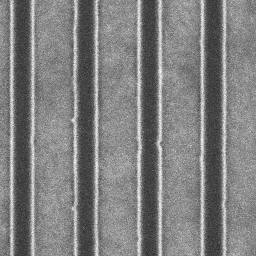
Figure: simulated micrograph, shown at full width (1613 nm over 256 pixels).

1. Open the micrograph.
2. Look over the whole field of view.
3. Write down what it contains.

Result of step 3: one or a few lines or trenches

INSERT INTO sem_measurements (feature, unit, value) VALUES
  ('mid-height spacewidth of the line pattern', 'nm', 258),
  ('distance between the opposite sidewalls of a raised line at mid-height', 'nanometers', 143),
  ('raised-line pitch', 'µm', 0.401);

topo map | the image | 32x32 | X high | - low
-XXX-----XXX-----XXX-----XXX----
-XXX-----XXX-----XXX-----XXX----
-XXX-----XXX-----XXX-----XXX----
-XXX-----XXX-----XXX-----XXX----
-XXX-----XXX-----XXX-----XXX----
--XX-----XXX-----XXX-----XXX----
-XXX-----XXX-----XXX-----XXX----
-XXX-----XXX-----XXX-----XXX----
-XXX-----XXX-----XXX-----XXX----
-XXX-----XXX-----XXX-----XXX----
-XXX-----XXX-----XXX-----XXX----
-XXX-----XXX-----XXX-----XXX----
-XXX-----XXX-----XXX-----XXX----
-XXX-----XXX-----XXX-----XXX----
-XXX-----XXX-----XXX-----XXX----
-XXX-----XXX-----XXX-----XXX----
-XXX-----XXX-----XXX-----XXX----
-XXX-----XXX-----XXX-----XXX----
-XXX-----XXX-----XXX-----XXX----
-XXX-----XXX-----XXX-----XXX----
-XXX-----XXX-----XXX-----XXX----
-XXX-----XXX-----XXX-----XXX----
-XXX-----XXX-----XXX-----XXX----
-XXX-----XXX-----XXX-----XXX----
-XXX-----XXX-----XXX-----XXX----
-XXX-----XXX-----XXX-----XXX----
-XXX-----XXX-----XXX-----XXX----
-XXX-----XXX-----XXX-----XXX----
-XXX-----XXX-----XXX-----XXX----
-XXX-----XXX-----XXX-----XXX----
-XXX-----XXX-----XXX-----XXX----
-XXX-----XXX-----XXX-----XXX----